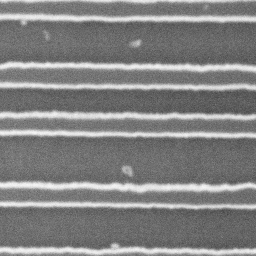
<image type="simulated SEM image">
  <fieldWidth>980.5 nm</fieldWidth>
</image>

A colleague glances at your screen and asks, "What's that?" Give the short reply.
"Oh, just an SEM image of lines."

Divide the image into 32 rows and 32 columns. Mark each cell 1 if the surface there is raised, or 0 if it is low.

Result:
11111111111111111111111111111111
11111111111111111111111111111111
00000000000000000000000000000000
00000000000000000000000000000000
00000000000000000000000000000000
00000000000000000000000000000000
00000000000000000000000000000000
00000000000000000000000000000000
11111111111111111111111111111110
11111111111111111111111111111111
11111111111111111111111111111111
00000000000000000000000000000000
00000000000000000000000000000000
00000000000000000000000000000000
11111111111111111101011011000000
11111111111111111111111111111111
11111111111111111111111111111111
00000000000000000000000000000000
00000000000000000000000000000000
00000000000000000000000000000000
00000000000000000000000000000000
00000000000000000000000000000000
00000000000000000000000000000000
11111111111111111111111111111111
11111111111111111111111111111111
11111111111111111111111111111111
00000000000000000000000000000000
00000000000000000000000000000000
00000000000000000000000000000000
00000000000000000000000000000000
00000000000000000000000000000000
11111111111111111111111111111111